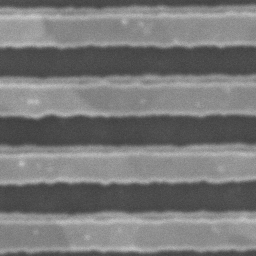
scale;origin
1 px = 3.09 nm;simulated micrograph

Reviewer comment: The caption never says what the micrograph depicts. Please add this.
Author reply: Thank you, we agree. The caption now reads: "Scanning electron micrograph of lines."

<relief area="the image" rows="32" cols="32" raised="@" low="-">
--------------------------------
@@@@@@@@@@@@@@@@@@@@@@@@@@@@@@@@
@@@@@@@@@@@@@@@@@@@@@@@@@@@@@@@@
@@@@@@@@@@@@@@@@@@@@@@@@@@@@@@@@
@@@@@@@@@@@@@@@@@@@@@@@@@@@@@@@@
@@@@@@@@@@@@@@@@@@@@@@@@@@@@@@@@
--------------------------------
--------------------------------
--------------------------------
--------------------------------
@@@@@@@@@@@@@@@@@@@@@@@@@@@@@@@@
@@@@@@@@@@@@@@@@@@@@@@@@@@@@@@@@
@@@@@@@@@@@@@@@@@@@@@@@@@@@@@@@@
@@@@@@@@@@@@@@@@@@@@@@@@@@@@@@@@
---@@---@----@------------------
--------------------------------
--------------------------------
--------------------------------
------------@-------@@--@@@@@@@-
@@@@@@@@@@@@@@@@@@@@@@@@@@@@@@@@
@@@@@@@@@@@@@@@@@@@@@@@@@@@@@@@@
@@@@@@@@@@@@@@@@@@@@@@@@@@@@@@@@
@@@@@@@@@@@@@@@@@@@@@@@@@@@@@@@-
--------------------------------
--------------------------------
--------------------------------
--------------------------------
@@@@@@@@@@@@@@@@@@@@@@@@@@@@@@@@
@@@@@@@@@@@@@@@@@@@@@@@@@@@@@@@@
@@@@@@@@@@@@@@@@@@@@@@@@@@@@@@@@
@@@@@@@@@@@@@@@@@@@@@@@@@@@@@@@@
@--@@---------------------------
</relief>